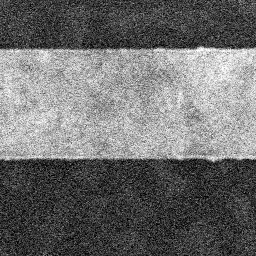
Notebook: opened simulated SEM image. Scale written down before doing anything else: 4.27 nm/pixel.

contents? one or a few lines or trenches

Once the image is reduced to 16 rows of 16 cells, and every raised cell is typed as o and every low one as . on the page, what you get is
................
................
................
oooooooooooooooo
oooooooooooooooo
oooooooooooooooo
oooooooooooooooo
oooooooooooooooo
oooooooooooooooo
oooooooooooooooo
................
................
................
................
................
................